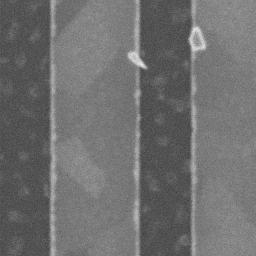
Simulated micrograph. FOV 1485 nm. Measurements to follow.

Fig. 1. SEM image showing one or a few lines or trenches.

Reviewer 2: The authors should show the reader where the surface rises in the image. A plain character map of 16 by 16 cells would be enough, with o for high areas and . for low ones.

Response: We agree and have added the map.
...oooooo...oooo
...oooooo...oooo
...oooooo...oooo
...oooooo...oooo
...oooooo...oooo
...oooooo...oooo
...oooooo...oooo
...oooooo...oooo
...oooooo...oooo
...oooooo...oooo
...oooooo...oooo
...oooooo...oooo
...oooooo...oooo
...oooooo...oooo
...oooooo...oooo
...oooooo...oooo